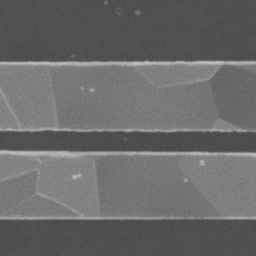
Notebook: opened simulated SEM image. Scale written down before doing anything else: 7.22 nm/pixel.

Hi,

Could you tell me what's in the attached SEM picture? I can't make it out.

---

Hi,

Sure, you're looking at lines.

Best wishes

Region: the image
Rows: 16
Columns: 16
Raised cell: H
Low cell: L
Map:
LLLLLLLLLLLLLLLL
LLLLLLLLLLLLLLLL
LLLLLLLLLLLLLLLL
LLLLLLLLLLLLLLLL
HHHHHHHHHHHHHHHH
HHHHHHHHHHHHHHHH
HHHHHHHHHHHHHHHH
HHHHHHHHHHHHHHHH
LLLLLLLLLLLLLLLL
LLLLLLLLLLLLLLLL
HHHHHHHHHHHHHHHH
HHHHHHHHHHHHHHHH
HHHHHHHHHHHHHHHH
HHHHHHHHHHHHHHHH
LLLLLLLLLLLLLLLL
LLLLLLLLLLLLLLLL